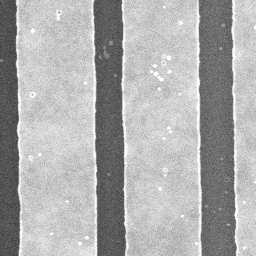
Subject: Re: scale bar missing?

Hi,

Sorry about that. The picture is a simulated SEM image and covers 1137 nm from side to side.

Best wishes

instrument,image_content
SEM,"lines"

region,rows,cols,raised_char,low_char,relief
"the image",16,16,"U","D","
DUUUUUDDUUUUDDDU
DUUUUUDDUUUUDDDU
DUUUUUDDUUUUDDDU
DUUUUUDDUUUUDDDU
DUUUUUDDUUUUDDDU
DUUUUUDDUUUUDDDU
DUUUUUDDUUUUDDDU
DUUUUUDDUUUUDDDU
DUUUUUDDUUUUDDDU
DUUUUUDDUUUUDDDU
DUUUUUDDUUUUDDDU
DUUUUUDDUUUUUDDU
DUUUUUDDUUUUUDDU
DUUUUUDDUUUUUDDU
DUUUUUDDUUUUUDDU
DUUUUUDDUUUUUDDU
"